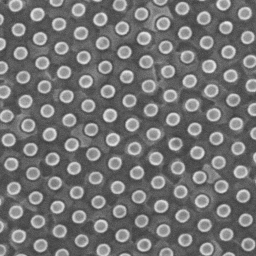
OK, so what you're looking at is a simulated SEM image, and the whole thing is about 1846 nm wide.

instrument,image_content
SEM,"a regular array of raised bodies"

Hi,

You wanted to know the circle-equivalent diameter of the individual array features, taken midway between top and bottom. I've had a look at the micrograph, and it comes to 87.6 nanometers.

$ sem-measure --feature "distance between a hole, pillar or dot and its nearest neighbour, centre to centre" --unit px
23.6